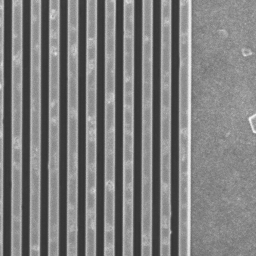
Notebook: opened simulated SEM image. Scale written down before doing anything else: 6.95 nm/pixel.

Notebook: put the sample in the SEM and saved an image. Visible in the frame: parallel lines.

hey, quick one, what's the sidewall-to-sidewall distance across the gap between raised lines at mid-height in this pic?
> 52.1 nm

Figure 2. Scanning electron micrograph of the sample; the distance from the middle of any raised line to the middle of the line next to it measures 129 nanometres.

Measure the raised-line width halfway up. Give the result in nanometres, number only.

76.5